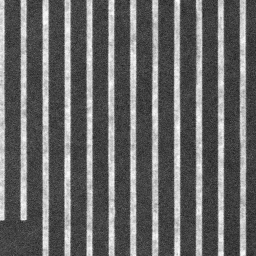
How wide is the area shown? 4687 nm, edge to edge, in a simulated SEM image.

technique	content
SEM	parallel lines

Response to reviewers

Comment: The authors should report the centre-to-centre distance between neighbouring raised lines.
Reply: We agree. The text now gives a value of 402 nm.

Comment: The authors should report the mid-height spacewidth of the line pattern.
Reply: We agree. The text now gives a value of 316 nm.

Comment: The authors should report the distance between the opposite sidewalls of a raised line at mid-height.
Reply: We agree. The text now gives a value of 4.5 pixels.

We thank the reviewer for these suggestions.